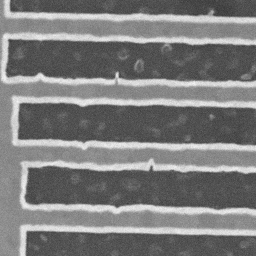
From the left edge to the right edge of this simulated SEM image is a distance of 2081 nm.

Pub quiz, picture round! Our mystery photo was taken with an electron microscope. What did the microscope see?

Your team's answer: one or a few lines or trenches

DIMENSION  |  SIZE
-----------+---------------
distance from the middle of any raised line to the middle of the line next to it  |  520 nanometres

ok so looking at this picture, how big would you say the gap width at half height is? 344 nanometers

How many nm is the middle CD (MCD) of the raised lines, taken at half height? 176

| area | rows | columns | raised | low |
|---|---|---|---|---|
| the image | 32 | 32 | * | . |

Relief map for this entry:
*...............................
*...............................
******************************..
********************************
********************************
*...............................
*...............................
*...............................
................................
*...............................
**************************...**.
********************************
**...*...***********************
**..............................
**..............................
**..............................
**..............................
**..............................
*******************************.
********************************
******..************************
***.............................
***.............................
***.............................
***.............................
***.............................
***************************.***.
********************************
***.****************************
***.............................
***.............................
***.............................